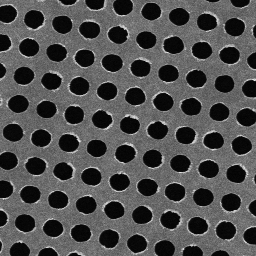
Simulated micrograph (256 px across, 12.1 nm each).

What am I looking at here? a regular array of holes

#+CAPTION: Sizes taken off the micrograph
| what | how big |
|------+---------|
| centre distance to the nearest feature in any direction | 341 nanometers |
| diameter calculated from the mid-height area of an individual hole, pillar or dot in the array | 18.9 px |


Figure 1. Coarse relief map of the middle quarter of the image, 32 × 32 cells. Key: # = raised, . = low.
####..####.....##.....###..#####
###########...###.....##....####
#################....###.....##.
###..###################....##..
##....#########################.
#.....###....###################
#.....##.....###....############
###..###.....###....####..######
#########...###.....###....#####
################....##.....###..
#######################....##...
.....###################..###...
.....###...###################..
.....##.....###..###############
#...###.....##.....####.########
########...###.....##.....######
##############.....##.....##....
################.####.....##....
...###################...###....
....##....###################...
....##.....###..################
...###.....##.....###..#########
######....###.....##....########
#############....###....###....#
##############..####....###.....
..###################...###....#
..###...###################....#
..##.....####..#################
..##.....###....################
#####....##.....###....#########
############....##.....###....##
#############..####....##.....##